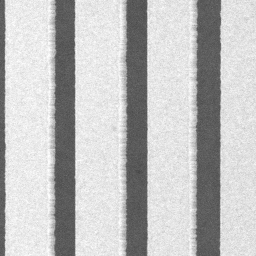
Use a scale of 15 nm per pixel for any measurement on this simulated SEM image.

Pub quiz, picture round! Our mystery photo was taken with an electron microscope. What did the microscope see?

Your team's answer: lines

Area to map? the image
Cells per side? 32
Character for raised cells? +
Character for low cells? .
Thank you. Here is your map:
.++++++..+++++++..++++++....++++
.++++++..++++++...++++++....++++
.++++++..+++++++..++++++....++++
.++++++..+++++++..++++++....++++
.++++++..+++++++..++++++....++++
.++++++..++++++...++++++....++++
.++++++..++++++...++++++....++++
.++++++..++++++...++++++....++++
.++++++..++++++...++++++....++++
.++++++..++++++...++++++....++++
.++++++..++++++...++++++....++++
.++++++..++++++...++++++....++++
.++++++..++++++...++++++....++++
.++++++..++++++...++++++....++++
.++++++..++++++...++++++....++++
.++++++..++++++...++++++....++++
.+++++...++++++...++++++....++++
.++++++..++++++...++++++....++++
.+++++...++++++...++++++....++++
.++++++..++++++...++++++....++++
.++++++..++++++...++++++....++++
.+++++...++++++...++++++....++++
.+++++...++++++...++++++....++++
.+++++...++++++...++++++....++++
.++++++..+++++++..++++++....++++
.+++++...++++++...++++++....++++
.++++++..++++++...++++++....++++
.++++++..++++++...++++++....++++
.+++++...++++++...++++++....++++
.+++++...++++++...++++++....++++
.+++++...++++++...++++++....++++
.++++++..++++++...++++++....++++